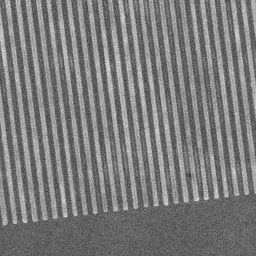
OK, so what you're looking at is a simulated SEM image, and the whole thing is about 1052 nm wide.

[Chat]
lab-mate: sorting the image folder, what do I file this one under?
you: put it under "parallel lines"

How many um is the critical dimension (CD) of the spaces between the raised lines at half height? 0.0239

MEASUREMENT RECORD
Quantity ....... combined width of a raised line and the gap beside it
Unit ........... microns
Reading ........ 0.0415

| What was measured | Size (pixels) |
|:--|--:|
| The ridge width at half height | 4.33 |